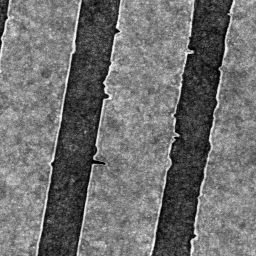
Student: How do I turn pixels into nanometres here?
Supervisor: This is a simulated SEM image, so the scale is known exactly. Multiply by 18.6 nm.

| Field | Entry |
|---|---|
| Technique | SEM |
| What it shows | one or a few lines or trenches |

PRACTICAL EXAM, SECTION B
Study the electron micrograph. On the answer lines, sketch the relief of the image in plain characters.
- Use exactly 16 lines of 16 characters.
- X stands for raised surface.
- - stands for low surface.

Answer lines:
-XXXX---XXXX--XX
XXXXX--XXXXX--XX
XXXXX--XXXXX--XX
XXXX---XXXXX--XX
XXXX---XXXX---XX
XXXX---XXXX---XX
XXXX---XXXX---XX
XXXX--XXXXX--XXX
XXXX--XXXXX--XXX
XXX---XXXXX--XXX
XXX---XXXXX--XXX
XXX---XXXX---XXX
XXX--XXXXX--XXXX
XXX--XXXXX--XXXX
XXX--XXXXX--XXXX
XX---XXXXX--XXXX